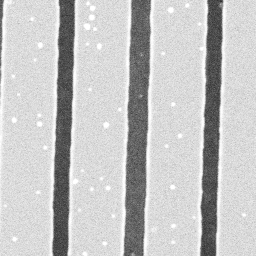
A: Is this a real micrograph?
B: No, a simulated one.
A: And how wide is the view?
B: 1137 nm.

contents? lines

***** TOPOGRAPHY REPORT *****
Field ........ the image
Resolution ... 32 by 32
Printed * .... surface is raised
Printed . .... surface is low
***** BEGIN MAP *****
.******..*******...*******..****
.******..*******...*******..****
*******..*******...*******..****
*******..*******...*******..****
*******..*******...*******..****
*******..*******...*******..****
*******..*******...*******..****
*******..*******...*******..****
*******..*******...*******..****
*******..*******...*******..****
*******..*******...*******..****
*******..*******...*******..****
*******..*******...*******..****
*******..*******...*******..****
*******..*******...******...****
*******..*******...******...****
*******..*******...******..*****
*******..*******...******..*****
*******..*******..*******..*****
*******..*******..*******..*****
*******..*******..*******..*****
*******..*******..*******..*****
*******..*******..*******..*****
*******..*******..*******..*****
*******..*******..*******..*****
*******..******...*******..*****
*******..*******..*******..*****
*******..*******..*******..*****
*******..******...*******..*****
*******..******...*******..*****
******...******...*******..*****
*******..******...*******..*****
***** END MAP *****